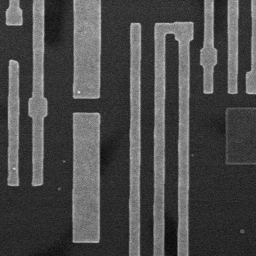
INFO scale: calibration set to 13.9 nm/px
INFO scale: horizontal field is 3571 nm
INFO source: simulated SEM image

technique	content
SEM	wiring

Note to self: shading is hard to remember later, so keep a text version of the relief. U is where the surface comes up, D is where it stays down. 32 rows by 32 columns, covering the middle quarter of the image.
DDDUUUUUUDDDDDDDDUUDDDDUUDDDDUUD
DDDUUUUUUDDDDDDDDUUDDDDUUDDDDUUD
DDDUUUUUUDDDDDDDDUUDDDDUUDDDDUUD
DDDUUUUUUDDDDDDDDUUDDDDUUDDDDUUD
DDUUUUUUUDDDDDDDDUUDDDDUUDDDDUUD
DDUUUUUUUDDDDDDDDUUDDDDUUDDDDUUD
DDUUUUUUUDDDDDDDDUUDDDDUUDDDDUUD
DDUUUUUUUDDDDDDDDUUDDDDUUDDDDUUD
DDDDDDDDDDDDDDDDDUUDDDDUUDDDDUUD
DDDDDDDDDDDDDDDDDUUDDDDUUDDDDUUD
DDDDDDDDDDDDDDDDDUUDDDDUUDDDDUUD
DDDDDDDDDDDDDDDDDUUDDDDUUDDDDUUD
DDDUUUUUUDDDDDDDDUUDDDDUUDDDDUUD
DDUUUUUUUDDDDDDDDUUDDDDUUDDDDUUD
DDUUUUUUUDDDDDDDDUUDDDDUUDDDDUUD
DDUUUUUUUDDDDDDDDUUDDDDUUDDDDUUD
DDUUUUUUUDDDDDDDDUUDDDDUUDDDDUUD
DDUUUUUUUDDDDDDDDUUDDDDUUDDDDUUD
DDUUUUUUUDDDDDDDDUUDDDDUUDDDDUUD
DDUUUUUUUDDDDDDDDUUDDDDUUDDDDUUD
DDUUUUUUUDDDDDDDDUUDDDDUUDDDDUUD
DDUUUUUUUDDDDDDDDUUDDDDUUDDDDUUD
DDUUUUUUUDDDDDDDDUUDDDDUUDDDDUUD
DDUUUUUUUDDDDDDDDUUDDDDUUDDDDUUD
DDUUUUUUUDDDDDDDDUUDDDDUUDDDDUUD
DDUUUUUUUDDDDDDDDUUDDDDUUDDDDUUD
DDUUUUUUUDDDDDDDDUUDDDDUUDDDDUUD
DDUUUUUUUDDDDDDDDUUDDDDUUDDDDUUD
DDUUUUUUUDDDDDDDDUUDDDDUUDDDDUUD
DDUUUUUUUDDDDDDDDUUDDDDUUDDDDUUD
DDUUUUUUUDDDDDDDDUUDDDDUUDDDDUUD
DDUUUUUUUDDDDDDDDUUDDDDUUDDDDUUD